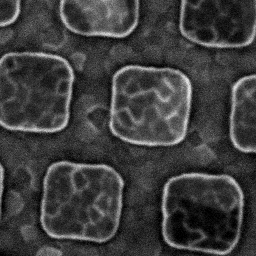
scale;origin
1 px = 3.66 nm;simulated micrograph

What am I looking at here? raised bodies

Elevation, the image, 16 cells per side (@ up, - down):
@---@@@@@--@@@@@
----@@@@---@@@@@
------------@@@@
@@@-------------
@@@@---@@@@-----
@@@@---@@@@@---@
@@@@---@@@@@---@
@@@@---@@@@@--@@
-------@@@@---@@
----------------
---@@@@---------
---@@@@@---@@@@-
---@@@@@--@@@@@-
---@@@@---@@@@@-
---@@@@---@@@@@-
-----------@@@--